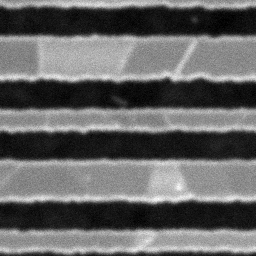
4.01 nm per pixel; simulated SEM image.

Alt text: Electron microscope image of lines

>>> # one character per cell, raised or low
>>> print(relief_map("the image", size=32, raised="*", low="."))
********************************
................................
................................
................................
................................
********************************
********************************
********************************
********************************
********************************
................................
................................
................................
................................
********************************
********************************
................................
................................
................................
................................
********************************
********************************
********************************
********************************
********************************
................................
................................
................................
................................
********************************
********************************
.*.....**.*..*..................